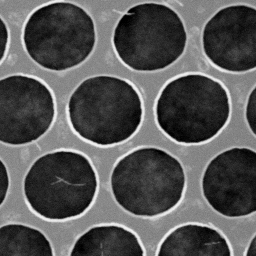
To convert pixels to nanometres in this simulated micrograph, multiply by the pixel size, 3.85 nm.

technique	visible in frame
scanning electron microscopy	holes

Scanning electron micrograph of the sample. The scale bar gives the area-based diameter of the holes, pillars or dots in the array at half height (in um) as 0.27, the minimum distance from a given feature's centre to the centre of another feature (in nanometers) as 323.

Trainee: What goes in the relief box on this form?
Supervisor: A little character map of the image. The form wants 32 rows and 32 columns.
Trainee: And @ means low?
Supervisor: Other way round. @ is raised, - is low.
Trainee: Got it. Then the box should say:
@@@@@@---@@@@@@@@@-@@@@@@@@@@@@@
@@@@-------@@@@@------@@@@@-----
@@@@--------@@@--------@@@------
-@@---------@@@--------@@@------
-@@---------@@---------@@-------
-@@---------@@---------@@-------
-@@--------@@@@--------@@@------
@@@@-------@@@@-------@@@@------
@@@@@@---@@@@@@@@---@@@@@@@@----
@@-@@@@@@@@@@@@@@@@@@@@--@@@@@@@
-----@@@@@------@@@@@------@@@@@
------@@@--------@@@--------@@@-
-------@@--------@@@--------@@@-
-------@@---------@@---------@@-
-------@@---------@@---------@@-
------@@@--------@@@--------@@@-
------@@@@-------@@@@------@@@@@
----@@@@@@@-----@@@@@@----@@@@@@
@@@@@@@@@@@@@@@@@@-@@@@@@@@@@@@@
@@@@@-----@@@@@@-----@@@@@@-----
@@@@-------@@@@-------@@@@------
-@@@--------@@---------@@@------
-@@---------@@---------@@-------
-@@---------@@---------@@-------
-@@---------@@---------@@@------
@@@@-------@@@@-------@@@@------
@@@@@-----@@@@@@-----@@@@@@-----
@@@@@@@@@@@@@@@@@@@@@@@@@@@@@@@@
----@@@@@@@@---@@@@@@@----@@@@@@
------@@@@-------@@@@-------@@@@
------@@@--------@@@--------@@@-
------@@@---------@@---------@@-